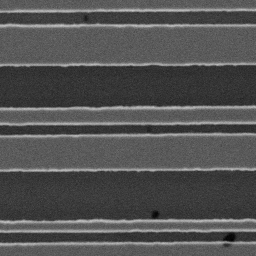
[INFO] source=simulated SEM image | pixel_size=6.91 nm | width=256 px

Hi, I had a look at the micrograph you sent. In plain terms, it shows lines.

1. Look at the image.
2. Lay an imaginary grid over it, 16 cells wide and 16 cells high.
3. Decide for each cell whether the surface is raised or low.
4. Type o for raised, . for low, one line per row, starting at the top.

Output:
oooooooooooooooo
oooooooooooooooo
oooooooooooooooo
oooooooooooooooo
................
................
................
oooooooooooooooo
oooooooooooooooo
oooooooooooooooo
oooooooooooooooo
................
................
................
oooooooooooooooo
oooooooooooooooo